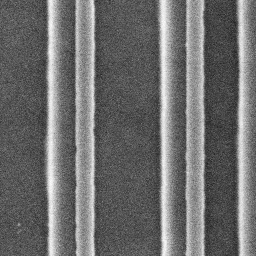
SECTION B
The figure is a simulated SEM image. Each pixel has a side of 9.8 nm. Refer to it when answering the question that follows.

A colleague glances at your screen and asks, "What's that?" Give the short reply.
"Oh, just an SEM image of lines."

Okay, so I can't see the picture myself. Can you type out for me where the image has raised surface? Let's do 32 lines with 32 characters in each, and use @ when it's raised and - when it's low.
------@@@@@---------@@@@@-----@@
------@@@@@----------@@@@-----@@
------@@@@@@---------@@@@-----@@
------@@@@@----------@@@@-----@@
------@@@@@----------@@@@-----@@
------@@@@@@--------@@@@@-----@@
------@@@@@@---------@@@@-----@@
------@@@@@----------@@@@-----@@
------@@@@@----------@@@@-----@@
------@@@@@@---------@@@@-----@@
------@@@@@----------@@@@-----@@
------@@@@@----------@@@@-----@@
------@@@@@----------@@@@-----@@
------@@@@@@---------@@@@-----@@
------@@@@@----------@@@@-----@@
------@@@@@----------@@@@-----@@
------@@@@@----------@@@@-----@@
------@@@@@----------@@@@-----@@
------@@@@@----------@@@@-----@@
------@@@@@----------@@@@-----@@
------@@@@@----------@@@@-----@@
------@@@@@----------@@@@-----@@
------@@@@@----------@@@@-----@@
------@@@@@----------@@@@-----@@
------@@@@@----------@@@@-----@@
------@@@@@----------@@@@-----@@
------@@@@@----------@@@@-----@@
------@@@@@----------@@@@-----@@
------@@@@@----------@@@@-----@@
------@@@@@----------@@@@-----@@
------@@@@@----------@@@@-----@@
------@@@@@@---------@@@@-----@@